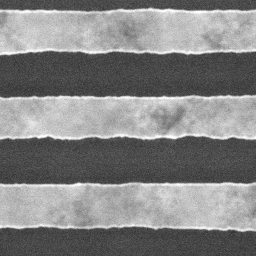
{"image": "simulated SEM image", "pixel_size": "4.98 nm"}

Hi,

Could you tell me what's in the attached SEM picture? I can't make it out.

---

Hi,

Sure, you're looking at lines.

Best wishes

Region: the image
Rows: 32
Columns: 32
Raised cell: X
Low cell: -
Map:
--------------------------------
XXXXXXXXXXXXXXXXXXXXXXXXXXXXXXXX
XXXXXXXXXXXXXXXXXXXXXXXXXXXXXXXX
XXXXXXXXXXXXXXXXXXXXXXXXXXXXXXXX
XXXXXXXXXXXXXXXXXXXXXXXXXXXXXXXX
XXXXXXXXXXXXXXXXXXXXXXXXXXXXXXXX
XXXX------XXXX--XXXXXXXXXXX-----
--------------------------------
--------------------------------
--------------------------------
--------------------------------
--------------------------------
XXXXXXXXXXXXXXXXXXXXXXXXXXXXXXXX
XXXXXXXXXXXXXXXXXXXXXXXXXXXXXXXX
XXXXXXXXXXXXXXXXXXXXXXXXXXXXXXXX
XXXXXXXXXXXXXXXXXXXXXXXXXXXXXXXX
XXXXXXXXXXXXXXXXXXXXXXXXXXXXXXXX
--------------------------------
--------------------------------
--------------------------------
--------------------------------
--------------------------------
--------------------------------
XXXXXXXXXXXXXXXXXXXXXXXXXXXXXXXX
XXXXXXXXXXXXXXXXXXXXXXXXXXXXXXXX
XXXXXXXXXXXXXXXXXXXXXXXXXXXXXXXX
XXXXXXXXXXXXXXXXXXXXXXXXXXXXXXXX
XXXXXXXXXXXXXXXXXXXXXXXXXXXXXXXX
-XX----XXXXX-X-----XXXXXXXXXXXXX
--------------------------------
--------------------------------
--------------------------------